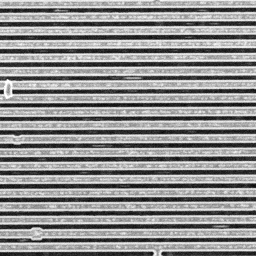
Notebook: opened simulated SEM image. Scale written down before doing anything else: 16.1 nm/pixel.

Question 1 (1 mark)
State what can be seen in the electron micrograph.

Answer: parallel lines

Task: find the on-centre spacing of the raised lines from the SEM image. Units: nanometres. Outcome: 218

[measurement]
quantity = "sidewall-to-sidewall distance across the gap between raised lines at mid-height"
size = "0.0929 micrometres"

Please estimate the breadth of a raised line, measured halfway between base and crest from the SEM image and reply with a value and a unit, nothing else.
0.123 µm